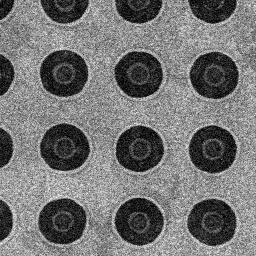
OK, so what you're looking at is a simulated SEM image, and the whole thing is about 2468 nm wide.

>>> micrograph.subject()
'a regular array of ring-shaped grooves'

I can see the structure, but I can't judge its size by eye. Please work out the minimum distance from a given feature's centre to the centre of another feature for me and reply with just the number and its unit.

0.712 microns